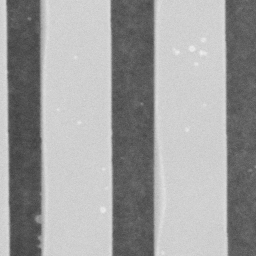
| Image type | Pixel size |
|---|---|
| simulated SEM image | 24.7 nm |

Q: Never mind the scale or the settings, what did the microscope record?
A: lines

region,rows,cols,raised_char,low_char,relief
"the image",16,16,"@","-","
---@@@@---@@@@--
---@@@@---@@@@--
---@@@@---@@@@--
---@@@@---@@@@--
---@@@@---@@@@--
---@@@@---@@@@--
---@@@@---@@@@--
---@@@@---@@@@--
---@@@@---@@@@--
@--@@@@---@@@@--
@--@@@@---@@@@--
@--@@@@---@@@@--
@--@@@@---@@@@--
@--@@@@---@@@@--
@--@@@@---@@@@--
@--@@@@---@@@@--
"